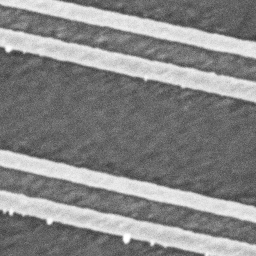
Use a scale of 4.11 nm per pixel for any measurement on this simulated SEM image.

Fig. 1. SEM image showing lines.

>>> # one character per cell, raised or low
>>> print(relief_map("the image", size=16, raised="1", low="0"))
1111110000000000
1111111111000000
1111111111111110
0001111111111111
0000000111111111
0000000000001111
0000000000000000
0000000000000000
0000000000000000
1000000000000000
1111100000000000
1111111110000000
1111111111111100
0011111111111111
0000001111111111
0000000000011111